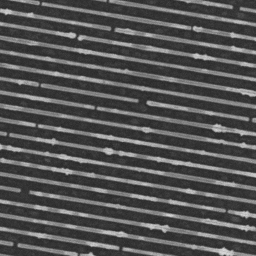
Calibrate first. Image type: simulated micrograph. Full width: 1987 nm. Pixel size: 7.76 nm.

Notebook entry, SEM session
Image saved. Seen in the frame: parallel lines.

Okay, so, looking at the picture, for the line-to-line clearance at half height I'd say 10.1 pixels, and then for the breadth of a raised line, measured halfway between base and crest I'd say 3.34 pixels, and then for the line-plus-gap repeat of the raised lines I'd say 104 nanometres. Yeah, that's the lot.